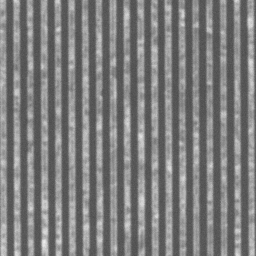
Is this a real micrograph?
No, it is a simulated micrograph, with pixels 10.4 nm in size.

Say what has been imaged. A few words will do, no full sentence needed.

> parallel lines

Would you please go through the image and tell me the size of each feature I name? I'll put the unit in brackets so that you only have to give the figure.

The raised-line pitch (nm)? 144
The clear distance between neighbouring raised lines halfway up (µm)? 0.0954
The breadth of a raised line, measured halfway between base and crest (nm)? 48.3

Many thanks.